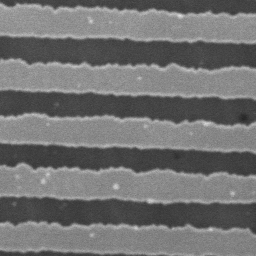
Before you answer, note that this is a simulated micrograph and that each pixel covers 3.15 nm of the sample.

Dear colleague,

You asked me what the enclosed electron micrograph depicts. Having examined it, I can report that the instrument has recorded lines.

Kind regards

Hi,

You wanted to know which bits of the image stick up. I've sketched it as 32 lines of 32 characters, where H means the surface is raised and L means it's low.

LLLLLLLLLLLLLLLLLLLLLLLLLLLLLLLL
HHHHHHHHHHHHHHHHHHHHHLLLLLLLLLLL
HHHHHHHHHHHHHHHHHHHHHHHHHHHHHHHH
HHHHHHHHHHHHHHHHHHHHHHHHHHHHHHHH
LHHHHHHHHHHHHHHHHHHHHHHHHHHHHHHH
LLLLLLLLLLLLLLLLLLLLLLLLLLLLLLLL
LLLLLLLLLLLLLLLLLLLLLLLLLLLLLLLL
LHLLLLLLLLLLLLLLLLLLLLLLLLLLLLLL
HHHHHHHHHHHHHHHHHHHHHHHLLLLLHHHL
HHHHHHHHHHHHHHHHHHHHHHHHHHHHHHHH
HHHHHHHHHHHHHHHHHHHHHHHHHHHHHHHH
LLLLLLLLHHHHHHHHHHHHHHHHHHHHHHHH
LLLLLLLLLLLLLLLLLLLLLLLLLLLLLLLL
LLLLLLLLLLLLLLLLLLLLLLLLLLLLLLLL
LLLHHHLLLLLLLLLLLLLLLLLLLLLLLLLL
HHHHHHHHHHHHHHHHHHHHHHHHHHHLLLLL
HHHHHHHHHHHHHHHHHHHHHHHHHHHHHHHH
HHHHHHHHHHHHHHHHHHHHHHHHHHHHHHHH
LLLLLLLLLLLLLLLLLHLLHHHHHHHHHHHH
LLLLLLLLLLLLLLLLLLLLLLLLLLLLLLLL
LLLLLLLLLLLLLLLLLLLLLLLLLLLLLLLL
HHHHHHHHHHHHHHHHHLHHHHLLLLLLLLLL
HHHHHHHHHHHHHHHHHHHHHHHHHHHHHHHH
HHHHHHHHHHHHHHHHHHHHHHHHHHHHHHHH
LLHHHHHHHHHHHHHHHHHHHHHHHHHHHHHH
LLLLLLLLLLLLLLLLLLLLLLLLLLLLLLLL
LLLLLLLLLLLLLLLLLLLLLLLLLLLLLLLL
LLLLLLLLLLLLLLLLLLLLLLLLLLLLLLLL
HHHHHHHHHHHHHHHHHHHHHLHHLLLLLLLL
HHHHHHHHHHHHHHHHHHHHHHHHHHHHHHHH
HHHHHHHHHHHHHHHHHHHHHHHHHHHHHHHH
LLLLLLLLLLLHHHHHHHHHHHHHHHHHHHHH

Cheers